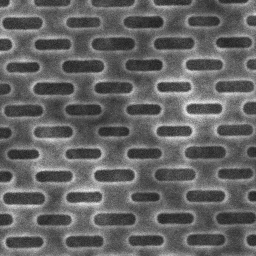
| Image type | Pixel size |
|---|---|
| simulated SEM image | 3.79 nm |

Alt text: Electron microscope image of a regular array of holes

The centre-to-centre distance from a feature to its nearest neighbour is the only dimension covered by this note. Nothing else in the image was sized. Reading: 140 nm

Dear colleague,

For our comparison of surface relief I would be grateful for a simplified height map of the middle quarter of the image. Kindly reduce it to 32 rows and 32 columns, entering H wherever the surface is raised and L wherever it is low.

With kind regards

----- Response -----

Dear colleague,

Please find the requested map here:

LLLLLLLLLLHHHHHLLLLLLLLLLHHHHHLL
LLLLLLLLLLHHHHHHLLLLLLLLHHHHHHHH
HHHHHHHHHHHHHHHHHHHHHHHHHHHHHHHH
HHHHHHHHHHHHHHHHHHHHHHHHHHHHHHHH
HHHHHHHHHLLLLLLLHHHHHHHHLLLLLLLH
LLLHHHHHLLLLLLLLLHHHHHHLLLLLLLLL
LLLHHHHHLLLLLLLLLHHHHHHLLLLLLLLL
LLHHHHHHHLHHHHHHHHHHHHHHHHHHHHHH
HHHHHHHHHHHHHHHHHHHHHHHHHHHHHHHH
HHHHHHHHHHHHHHHHHHHHHHHHHHHHHHHH
HLLLLLLLLHHHHHHHLLLLLLLLHHHHHHHL
LLLLLLLLLLHHHHHLLLLLLLLLHHHHHHLL
HLLLLLLLLHHHHHHHLLLLLLLHHHHHHHHL
HHHHHHHHHHHHHHHHHHHHHHHHHHHHHHHH
HHHHHHHHHHHHHHHHHHHHHHHHHHHHHHHH
LHHHHHHHHHHHHHHHHHHHHHHHLLLLLLLH
LLHHHHHHHLLLLLLLHHHHHHHLLLLLLLLL
LLHHHHHHHLLLLLLLHHHHHHHLLLLLLLLL
LHHHHHHHHHHHHHHHHHHHHHHHHHHHHHHH
HHHHHHHHHHHHHHHHHHHHHHHHHHHHHHHH
HHHHHHHHHHHHHHHHHHHHHHHHHHHHHHHL
HLLLLLLLLHHHHHHHLLLLLLLLHHHHHHLL
LLLLLLLLLHHHHHHHLLLLLLLLLHHHHHLL
HLLLLLLLLHHHHHHHLLLLLLLLHHHHHHHL
HHHHHHHHHHHHHHHHHHHHHHHHHHHHHHHH
HHHHHHHHHHHHHHHHHHHHHHHHHHHHHHHH
HHHHHHHHHLLLLLLLLHHHHHHLLLLLLLLL
LLHHHHHLLLLLLLLLLLHHHHHLLLLLLLLL
LLHHHHHHLLLLLLLLLLHHHHHLLLLLLLLL
LHHHHHHHHLLLLHHHHHHHHHHHHHHHHHHH
HHHHHHHHHHHHHHHHHHHHHHHHHHHHHHHH
HHHHHHHHHHHHHHHHHHHHHHHHHHHHHHHH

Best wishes